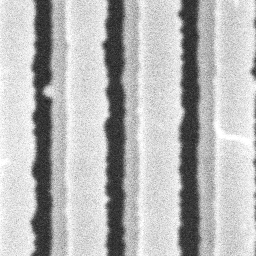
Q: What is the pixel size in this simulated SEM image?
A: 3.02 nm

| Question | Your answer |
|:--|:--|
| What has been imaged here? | lines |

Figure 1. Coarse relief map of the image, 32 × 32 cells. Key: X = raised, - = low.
XXXX---XXXXXX---XXXXXXX--XXXXXXX
XXXX---XXXXXX---XXXXXX---XXXXXXX
XXXX---XXXXXX---XXXXXXX--XXXXXXX
XXXX---XXXXXX--XXXXXXXX--XXXXXXX
XXXX---XXXXXX--XXXXXXXX--XXXXXXX
XXXX---XXXXXX---XXXXXXX--XXXXXXX
XXXX---XXXXXX---XXXXXXX--XXXXXXX
XXXX---XXXXXX---XXXXXXX--XXXXXXX
XXXX--XXXXXXX---XXXXXXX--XXXXXX-
XXXX---XXXXXX--XXXXXXXX--XXXXXX-
XXXX--XXXXXXX--XXXXXXX---XXXXXXX
XXXX--XXXXXXX---XXXXXXX--XXXXXXX
XXXX---XXXXXX---XXXXXXX--XXXXXXX
XXXX---XXXXXX---XXXXXXX--XXXXXXX
XXXX---XXXXXX---XXXXXXX--XXXXXXX
XXXX---XXXXXX---XXXXXX---XXXXXXX
XXXX---XXXXXX---XXXXXX---XXXXXXX
XXXX---XXXXXX---XXXXXX---XXXXXXX
XXXX---XXXXXX---XXXXXX---XXXXXXX
XXXX--XXXXXXX---XXXXXX---XXXXXXX
XXXX---XXXXXX---XXXXXX---XXXXXXX
XXXX---XXXXXX---XXXXXX---XXXXXXX
XXXX---XXXXXX---XXXXXX---XXXXXXX
XXXX---XXXXXX---XXXXXXX--XXXXXXX
XXXX---XXXXXX---XXXXXX---XXXXXXX
XXXX---XXXXXX---XXXXXX---XXXXXXX
XXXX---XXXXXX---XXXXXX---XXXXXXX
XXXX---XXXXXX--XXXXXXX---XXXXXXX
XXXX---XXXXXX---XXXXXX---XXXXXXX
XXXX---XXXXXX---XXXXXX---XXXXXXX
XXXX---XXXXXX---XXXXXX---XXXXXXX
XXXX--XXXXXXX---XXXXXX---XXXXXXX